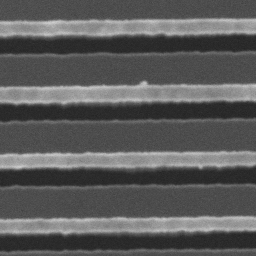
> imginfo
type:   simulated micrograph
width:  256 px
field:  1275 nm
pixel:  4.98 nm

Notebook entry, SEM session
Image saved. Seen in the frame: lines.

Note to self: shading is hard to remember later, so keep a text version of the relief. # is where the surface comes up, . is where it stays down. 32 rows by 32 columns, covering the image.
################################
################################
################################
################################
#...###....###..................
................................
........................#.#....#
################################
################################
################################
################################
################################
################################
................................
................................
################################
################################
################################
################################
################################
################################
................................
................................
################################
################################
################################
################################
################################
################################
................................
................................
...#############################